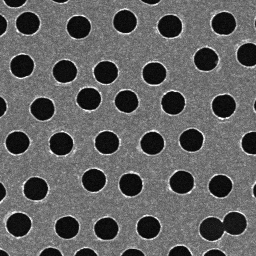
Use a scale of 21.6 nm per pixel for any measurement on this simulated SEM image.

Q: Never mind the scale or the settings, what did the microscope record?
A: a regular array of holes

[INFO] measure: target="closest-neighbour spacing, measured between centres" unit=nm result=854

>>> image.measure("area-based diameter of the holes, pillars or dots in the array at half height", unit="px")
23.6